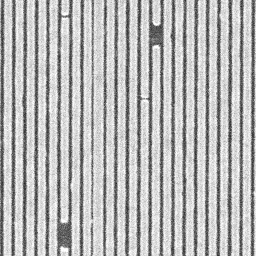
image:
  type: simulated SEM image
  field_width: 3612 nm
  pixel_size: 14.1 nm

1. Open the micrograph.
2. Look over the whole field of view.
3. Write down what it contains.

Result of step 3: parallel lines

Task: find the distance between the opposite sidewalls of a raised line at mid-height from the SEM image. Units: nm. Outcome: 95.3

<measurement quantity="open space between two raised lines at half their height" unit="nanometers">68.8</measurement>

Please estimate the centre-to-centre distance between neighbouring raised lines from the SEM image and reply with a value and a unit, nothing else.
0.161 µm